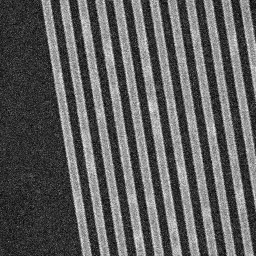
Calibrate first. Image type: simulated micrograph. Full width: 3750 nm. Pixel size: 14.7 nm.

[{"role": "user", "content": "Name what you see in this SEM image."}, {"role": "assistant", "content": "parallel lines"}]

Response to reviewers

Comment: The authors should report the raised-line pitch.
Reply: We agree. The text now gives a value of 261 nanometers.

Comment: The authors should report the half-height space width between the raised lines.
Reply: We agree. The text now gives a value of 10 pixels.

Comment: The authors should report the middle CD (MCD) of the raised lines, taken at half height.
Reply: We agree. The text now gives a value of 112 nm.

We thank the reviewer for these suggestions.